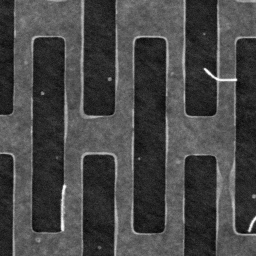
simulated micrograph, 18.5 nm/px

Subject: groups of lines, slits or small figures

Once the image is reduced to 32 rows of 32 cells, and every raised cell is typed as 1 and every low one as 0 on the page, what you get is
00111111110000011111111000011111
00111111110000011111111000011111
00111111110000011111111000011111
00111111110000011111111000011111
00111111110000011111111000011111
00110000110000011000011000011000
00110000110000011000011000011000
00110000110000011000011000011000
00110000110000011000011000011000
00110000110000011000011000011000
00110000110000011000011000011000
00110000110000111000011000011000
00110000110000111000011000011000
00110000110000111000011000011000
11110000111001111000011100111000
11110000111111111000011111111000
11110000111111111000011111111000
11110000111111111000011111111000
11110000111111111000011111111000
00110000111000111000011100011000
00110000110000011000011000011000
00110000110000011000011000011000
00110000110000111000011000011000
00110000110000111000011000011000
00110000110000111000011000011000
00110000110000111000011000011000
00110000110000111000011000011000
00110000110000010000011000011000
00110000110000011000011000011000
00111111110000011111111000011111
00111111110000111111111000011111
00111111110000111111111000011111